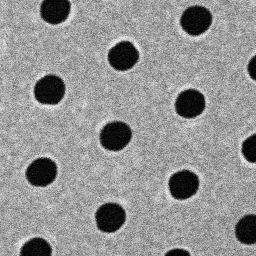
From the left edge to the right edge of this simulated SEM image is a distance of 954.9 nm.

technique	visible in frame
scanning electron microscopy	a regular array of holes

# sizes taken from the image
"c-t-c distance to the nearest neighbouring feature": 300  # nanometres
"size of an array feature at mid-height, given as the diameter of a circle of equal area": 114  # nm